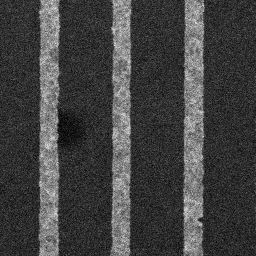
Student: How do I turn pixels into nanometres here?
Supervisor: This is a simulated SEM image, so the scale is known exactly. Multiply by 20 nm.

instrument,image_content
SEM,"one or a few lines or trenches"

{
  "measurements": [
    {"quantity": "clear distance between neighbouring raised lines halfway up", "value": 1.11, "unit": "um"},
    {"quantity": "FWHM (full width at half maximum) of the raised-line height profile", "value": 16.8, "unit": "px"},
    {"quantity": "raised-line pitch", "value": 72.2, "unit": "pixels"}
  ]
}